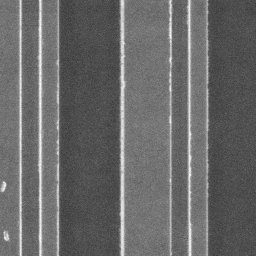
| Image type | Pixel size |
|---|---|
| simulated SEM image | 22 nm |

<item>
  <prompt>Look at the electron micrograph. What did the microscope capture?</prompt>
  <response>lines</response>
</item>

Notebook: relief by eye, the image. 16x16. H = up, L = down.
HHHHLLLLHHHHHLLL
HHHHLLLLHHHHHLLL
HHHHLLLLHHHHHLLL
HHHHLLLLHHHHHLLL
HHHHLLLLHHHHHLLL
HHHHLLLLHHHHHLLL
HHHHLLLLHHHHHLLL
HHHHLLLLHHHHHLLL
HHHHLLLLHHHHHLLL
HHHHLLLLHHHHHLLL
HHHHLLLLHHHHHLLL
HHHHLLLLHHHHHLLL
HHHHLLLLHHHHHLLL
HHHHLLLLHHHHHLLL
HHHHLLLLHHHHHLLL
HHHHLLLLHHHHHLLL